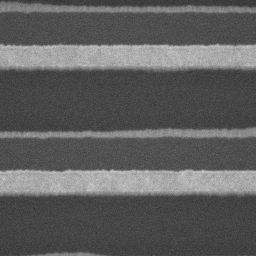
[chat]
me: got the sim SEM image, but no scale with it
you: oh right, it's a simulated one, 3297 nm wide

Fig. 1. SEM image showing lines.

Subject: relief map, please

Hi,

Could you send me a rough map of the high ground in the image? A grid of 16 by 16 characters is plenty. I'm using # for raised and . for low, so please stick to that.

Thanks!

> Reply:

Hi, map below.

###.............
################
################
################
................
................
................
................
################
################
################
################
................
................
................
................